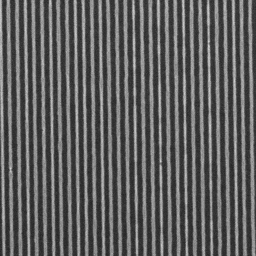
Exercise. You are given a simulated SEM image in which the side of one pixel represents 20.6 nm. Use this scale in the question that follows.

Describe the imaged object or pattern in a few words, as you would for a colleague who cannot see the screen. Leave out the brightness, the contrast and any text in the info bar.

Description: parallel lines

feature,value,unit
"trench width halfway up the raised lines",118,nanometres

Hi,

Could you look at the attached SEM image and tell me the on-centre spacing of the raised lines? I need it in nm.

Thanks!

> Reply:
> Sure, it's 172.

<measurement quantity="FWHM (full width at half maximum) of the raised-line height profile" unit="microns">0.0592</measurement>